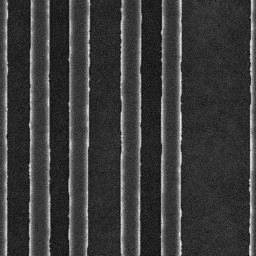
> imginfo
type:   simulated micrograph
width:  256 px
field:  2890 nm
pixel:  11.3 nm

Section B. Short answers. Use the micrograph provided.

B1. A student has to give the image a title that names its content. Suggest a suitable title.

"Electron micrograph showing lines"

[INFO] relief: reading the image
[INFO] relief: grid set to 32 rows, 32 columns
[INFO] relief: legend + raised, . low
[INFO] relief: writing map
+...++...++....+++..+++........+
+...++...++....+++..+++........+
+...++...++....+++..+++........+
+...++...++....+++..+++........+
+...++...++....+++..+++........+
+...++...++....+++..+++........+
+...++...++....+++..+++........+
+...++...++....+++..+++........+
+...++...++....++...++.........+
+...++...++....+++..+++........+
+...++...++....+++..+++........+
+...++...++....+++..+++........+
+...++...++....+++..++.........+
+...++...++....+++..++.........+
+...++...++....+++..+++........+
+...++...++....+++..+++........+
+...++...++....+++..+++........+
+...++...++....+++..+++........+
+...++...++....+++..++.........+
+...++...++....++...+++........+
+...++...++....++...+++........+
+...++...++....++...++.........+
+...++...++....++...++.........+
+...++...++....++...++.........+
+...++...++....++...++.........+
+...++...++....++...++.........+
+...++...++....++...+++........+
+...++...++....++...++.........+
+...++...++....++...++.........+
+...++...++....++...++.........+
+...++...++....++...+++........+
+...++...++....++...++.........+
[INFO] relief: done